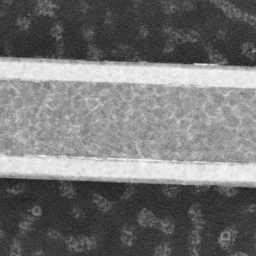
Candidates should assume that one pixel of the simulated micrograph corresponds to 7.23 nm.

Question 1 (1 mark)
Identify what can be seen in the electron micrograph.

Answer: one or a few lines or trenches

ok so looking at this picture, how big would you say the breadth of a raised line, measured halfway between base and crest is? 0.7 microns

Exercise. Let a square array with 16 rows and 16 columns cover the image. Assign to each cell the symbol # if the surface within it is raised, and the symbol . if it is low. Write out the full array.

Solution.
................
................
................
................
#####...........
################
################
################
################
################
....############
................
................
................
................
................